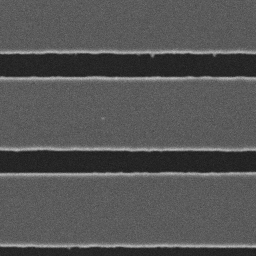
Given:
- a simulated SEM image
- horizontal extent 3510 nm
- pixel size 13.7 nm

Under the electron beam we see lines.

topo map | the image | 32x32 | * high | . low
********************************
********************************
********************************
********************************
********************************
********************************
********************************
................................
................................
................................
********************************
********************************
********************************
********************************
********************************
********************************
********************************
********************************
********************************
................................
................................
................................
********************************
********************************
********************************
********************************
********************************
********************************
********************************
********************************
********************************
................................